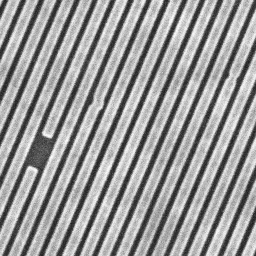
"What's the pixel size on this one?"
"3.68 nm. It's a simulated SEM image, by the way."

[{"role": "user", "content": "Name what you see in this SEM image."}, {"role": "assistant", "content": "parallel lines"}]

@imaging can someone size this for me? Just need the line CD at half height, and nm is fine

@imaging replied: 36.1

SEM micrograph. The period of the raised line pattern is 60.9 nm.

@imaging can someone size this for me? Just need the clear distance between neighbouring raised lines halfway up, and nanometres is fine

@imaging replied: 25.4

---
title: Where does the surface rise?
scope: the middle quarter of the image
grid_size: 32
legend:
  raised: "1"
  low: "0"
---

00110011100110011100110011100110
01110011001110011001110011001110
01100111001100111001100111001100
01100110001100110001100110001100
11000110011000110011000110011000
11001110011001110011001110011001
11001100111001100111001100111001
10011100110011100110011100110011
10011000110011001110011001110011
00011000110011001100011001100011
00110001100110001100110001100110
00110011100110011100110011100110
01110011001110011001110011001110
01100111001100111001100111001100
11100110011100110011100110011100
11001110011000110011000110011000
11001100011001100011001100011001
10001100110001100110001100111001
10011100110011100110011100110011
10011001110011001110011001110011
00111001100111001100111001100111
00110011100110011100110001100110
00110011000110011000110011001110
01100011001100011001100011001100
01100111001100111001100111001100
11100110011100110011100110011100
11001110011001110011001110011001
11001100111001100111001100111001
10001100110001100110001100110011
10011000110011000110011000110011
00011001110011001110011001110111
00111001100111001100111001100111